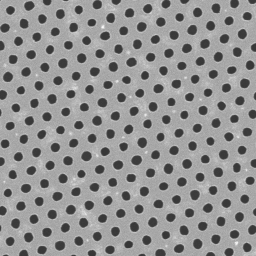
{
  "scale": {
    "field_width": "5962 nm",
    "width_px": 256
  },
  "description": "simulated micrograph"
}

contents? a regular array of holes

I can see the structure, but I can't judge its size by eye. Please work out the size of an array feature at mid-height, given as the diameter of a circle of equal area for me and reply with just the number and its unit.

220 nanometres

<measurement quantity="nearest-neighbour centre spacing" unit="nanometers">426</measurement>